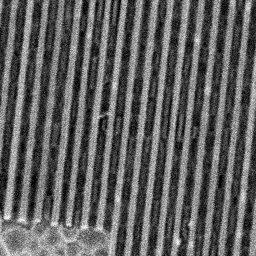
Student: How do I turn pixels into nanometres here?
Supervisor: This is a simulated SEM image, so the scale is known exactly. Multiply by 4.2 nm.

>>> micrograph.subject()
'parallel lines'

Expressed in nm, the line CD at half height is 24.5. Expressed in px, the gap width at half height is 10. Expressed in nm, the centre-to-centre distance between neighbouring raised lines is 65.